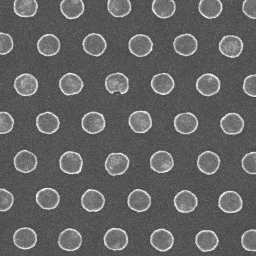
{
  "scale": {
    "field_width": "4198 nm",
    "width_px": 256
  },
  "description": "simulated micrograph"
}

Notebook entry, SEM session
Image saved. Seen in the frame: a regular array of raised bodies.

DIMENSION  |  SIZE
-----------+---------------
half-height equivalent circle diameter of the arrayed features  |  0.362 microns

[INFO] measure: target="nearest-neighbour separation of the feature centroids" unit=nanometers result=729